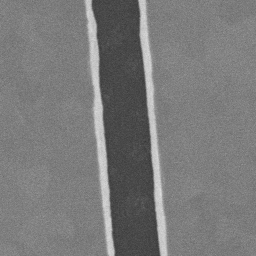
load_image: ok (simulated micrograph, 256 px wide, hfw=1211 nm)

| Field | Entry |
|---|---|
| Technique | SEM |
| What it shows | one or a few lines or trenches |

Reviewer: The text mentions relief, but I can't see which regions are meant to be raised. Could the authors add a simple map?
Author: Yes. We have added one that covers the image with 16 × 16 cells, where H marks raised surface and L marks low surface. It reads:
HHHHHHLLLHHHHHHH
HHHHHHLLLHHHHHHH
HHHHHHLLLHHHHHHH
HHHHHHLLLHHHHHHH
HHHHHHLLLHHHHHHH
HHHHHHLLLHHHHHHH
HHHHHHLLLHHHHHHH
HHHHHHLLLHHHHHHH
HHHHHHLLLLHHHHHH
HHHHHHLLLLHHHHHH
HHHHHHLLLLHHHHHH
HHHHHHHLLLHHHHHH
HHHHHHHLLLHHHHHH
HHHHHHHLLLHHHHHH
HHHHHHHLLLHHHHHH
HHHHHHHLLLHHHHHH